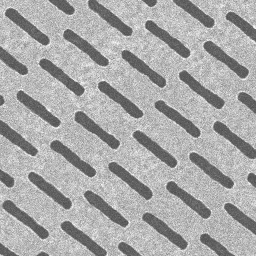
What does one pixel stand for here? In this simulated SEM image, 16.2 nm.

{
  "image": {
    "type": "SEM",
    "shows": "a regular array of holes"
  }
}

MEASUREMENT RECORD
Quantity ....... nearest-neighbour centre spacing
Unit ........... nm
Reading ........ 612